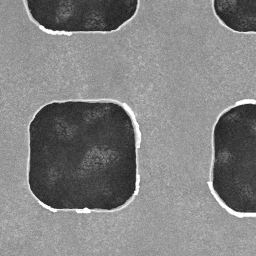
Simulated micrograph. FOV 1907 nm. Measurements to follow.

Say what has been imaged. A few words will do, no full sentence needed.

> holes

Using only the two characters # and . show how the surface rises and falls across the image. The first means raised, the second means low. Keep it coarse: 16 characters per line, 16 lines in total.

##.......####...
##......######..
################
################
################
################
###....########.
##......######..
##......#####...
##.......####...
##.......####...
##......#####...
###.....######..
################
################
################